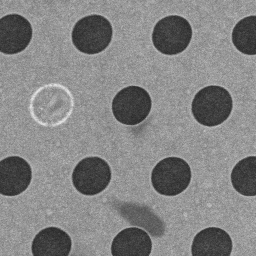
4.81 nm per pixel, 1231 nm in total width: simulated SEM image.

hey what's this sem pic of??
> holes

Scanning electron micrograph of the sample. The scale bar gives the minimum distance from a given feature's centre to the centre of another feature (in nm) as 385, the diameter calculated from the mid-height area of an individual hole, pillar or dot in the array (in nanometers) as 192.